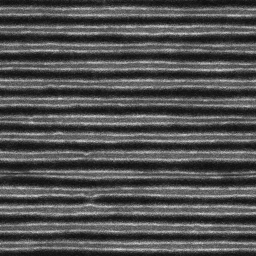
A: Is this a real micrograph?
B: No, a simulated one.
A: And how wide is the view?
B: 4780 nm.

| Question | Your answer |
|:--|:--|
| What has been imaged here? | parallel lines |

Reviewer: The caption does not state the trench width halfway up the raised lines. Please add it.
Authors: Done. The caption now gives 105 nm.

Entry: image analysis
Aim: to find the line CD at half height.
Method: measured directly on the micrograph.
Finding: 231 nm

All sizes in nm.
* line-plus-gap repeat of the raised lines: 336